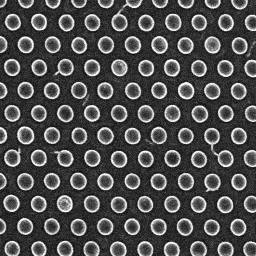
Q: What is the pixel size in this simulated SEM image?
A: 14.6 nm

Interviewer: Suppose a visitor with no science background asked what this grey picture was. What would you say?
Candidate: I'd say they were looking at a regular array of raised bodies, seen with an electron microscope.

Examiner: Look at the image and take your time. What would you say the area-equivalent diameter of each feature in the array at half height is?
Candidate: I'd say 224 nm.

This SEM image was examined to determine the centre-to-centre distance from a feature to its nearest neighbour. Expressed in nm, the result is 377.